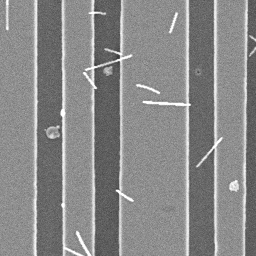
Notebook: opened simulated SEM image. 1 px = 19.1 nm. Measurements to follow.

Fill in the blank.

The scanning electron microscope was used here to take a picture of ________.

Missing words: lines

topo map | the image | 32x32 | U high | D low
UUUUUDDDUUUUDDDUUUUUUUUDDDDUUUUD
UUUUDDDDUUUUDDDUUUUUUUUDDDDUUUUD
UUUUDDDDUUUUDDDUUUUUUUUDDDDUUUUD
UUUUDDDDUUUUDDDUUUUUUUUDDDDUUUUD
UUUUDDDDUUUUDDDUUUUUUUUDDDDUUUUD
UUUUDDDDUUUUDDDUUUUUUUUUDDDUUUUD
UUUUUDDDUUUUDDDUUUUUUUUDDDDUUUUD
UUUUDDDDUUUUDDDUUUUUUUUDDDDUUUUD
UUUUDDDDUUUUDDDUUUUUUUUDDDDUUUUD
UUUUDDDDUUUUDDDUUUUUUUUDDDDUUUUD
UUUUDDDDUUUUDDDUUUUUUUUDDDDUUUUD
UUUUDDDDUUUUDDDUUUUUUUUDDDDUUUUD
UUUUDDDDUUUUDDDUUUUUUUUDDDDUUUUD
UUUUDDDDUUUUDDDUUUUUUUUUDDDUUUUD
UUUUDDDDUUUUDDDUUUUUUUUUDDDUUUUD
UUUUDDDDUUUUDDDUUUUUUUUDDDDUUUUD
UUUUDDDDUUUUDDDUUUUUUUUDDDDUUUUD
UUUUDDDDUUUUDDDUUUUUUUUDDDDUUUUD
UUUUDDDDUUUUDDDUUUUUUUUDDDDUUUUD
UUUUDDDDUUUUDDDUUUUUUUUDDDDUUUUD
UUUUDDDDUUUUDDDUUUUUUUUDDDDUUUUD
UUUUDDDDUUUUDDDUUUUUUUUDDDDUUUUD
UUUUDDDDUUUUDDDUUUUUUUUDDDDUUUUD
UUUUDDDDUUUUDDDUUUUUUUUDDDDUUUUD
UUUUDDDDUUUUDDDUUUUUUUUDDDDUUUUD
UUUUDDDDUUUUDDDUUUUUUUUDDDDUUUUD
UUUUDDDDUUUUDDDUUUUUUUUDDDDUUUUD
UUUUDDDDUUUUDDDUUUUUUUUUDDDUUUUD
UUUUDDDDUUUUDDDUUUUUUUUDDDDUUUUD
UUUUDDDDUUUUDDDUUUUUUUUDDDDUUUUD
UUUUDDDDUUUUDDDUUUUUUUUDDDDUUUUD
UUUUDDDDUUUUDDDUUUUUUUUDDDDUUUUD